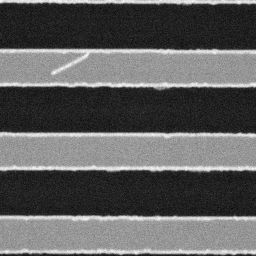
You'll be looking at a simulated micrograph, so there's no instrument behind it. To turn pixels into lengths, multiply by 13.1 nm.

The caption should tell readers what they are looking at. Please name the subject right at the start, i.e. lines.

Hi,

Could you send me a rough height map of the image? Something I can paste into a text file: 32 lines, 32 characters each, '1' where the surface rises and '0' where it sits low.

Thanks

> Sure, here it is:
00000000000000000000000000000000
00000000000000000000000000000000
00000000000000000000000000000000
00000000000000000000000000000000
00000000000000000000000000000000
00000000000000000000000000000000
11111111111111111111111111111111
11111111111111111111111111111111
11111111111111111111111111111111
11111111111111111111111111111111
11111111111111111111111111111111
00000000000000000000000000000000
00000000000000000000000000000000
00000000000000000000000000000000
00000000000000000000000000000000
00000000000000000000000000000000
00000000000000000000000000000000
11111111111111111111111111111111
11111111111111111111111111111111
11111111111111111111111111111111
11111111111111111111111111111111
00000000000000000000000000000000
00000000000000000000000000000000
00000000000000000000000000000000
00000000000000000000000000000000
00000000000000000000000000000000
00000000000000000000000000000000
11111111111111111111111111111111
11111111111111111111111111111111
11111111111111111111111111111111
11111111111111111111111111111111
11111111111111111111111111111111